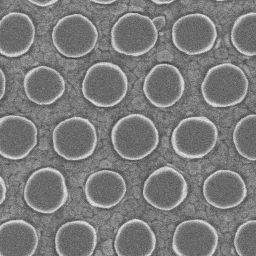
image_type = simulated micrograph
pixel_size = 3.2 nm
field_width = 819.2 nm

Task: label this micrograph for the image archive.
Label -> a regular array of raised bodies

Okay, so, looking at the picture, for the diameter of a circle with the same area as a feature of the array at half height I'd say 137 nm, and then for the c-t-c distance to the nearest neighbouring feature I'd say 0.189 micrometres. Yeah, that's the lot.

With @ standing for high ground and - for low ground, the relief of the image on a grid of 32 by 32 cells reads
----@@--------------------------
--------------------------------
@@@@----@@@----@@@@---@@@@----@@
@@@@---@@@@@--@@@@@---@@@@@--@@@
@@@@---@@@@@--@@@@@@--@@@@@--@@@
@@@@---@@@@@--@@@@@---@@@@@--@@@
@@@-----@@@----@@@-----@@-----@@
--------------------------------
-----@-----@@@@----@@@-----@@@--
@--@@@@@---@@@@@--@@@@@---@@@@@-
@--@@@@@--@@@@@@--@@@@@--@@@@@@-
@--@@@@@--@@@@@@--@@@@@--@@@@@@-
----@@@----@@@@----@@@----@@@@--
--------------------------------
-@--------------@@-------------@
@@@@---@@@@---@@@@@---@@@@@---@@
@@@@@--@@@@@--@@@@@@--@@@@@--@@@
@@@@@--@@@@@--@@@@@@--@@@@@--@@@
@@@@---@@@@@--@@@@@---@@@@@--@@@
-@@-----@@@----@@@-----@@-----@@
--------------------------------
-----@@-----@@-----@@@-----@@---
----@@@@---@@@@---@@@@@---@@@@--
@--@@@@@---@@@@@--@@@@@--@@@@@@-
@--@@@@@---@@@@---@@@@@---@@@@@-
---@@@@@----@@-----@@@----@@@@--
-----@--------------------------
----------------@---------------
@@@@---@@@@@---@@@@---@@@@----@@
@@@@@--@@@@@---@@@@---@@@@@--@@@
@@@@@--@@@@@--@@@@@---@@@@@--@@@
@@@@---@@@@@---@@@@---@@@@@---@@